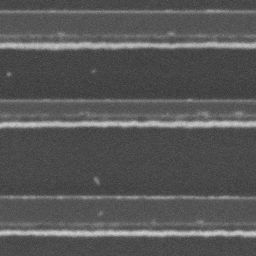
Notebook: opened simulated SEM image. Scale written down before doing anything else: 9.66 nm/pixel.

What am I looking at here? lines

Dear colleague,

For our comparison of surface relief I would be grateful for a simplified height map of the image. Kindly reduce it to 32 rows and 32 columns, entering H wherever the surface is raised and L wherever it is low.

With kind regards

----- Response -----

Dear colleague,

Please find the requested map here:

LLLLLLLLLLLLLLLLLLLLLLLLLLLLLLLL
HHHHHHHHHHHHHHHHHHHHHHHHHHHHHHHH
HHHHHHHHHHHHHHHHHHHHHHHHHHHHHHHH
HHHHHHHHHHHHHHHHHHHHHHHHHHHHHHHH
HHHHHHHHHHHHHHHHHHHHHHHHHHHHHHHH
HHHHHHHHHHHHHHHHHHHHHHHHHHHHHHHH
LLLLLLLLLLLLLLLLLLLLLLLLLLLLLLLL
LLLLLLLLLLLLLLLLLLLLLLLLLLLLLLLL
LLLLLLLLLLLLLLLLLLLLLLLLLLLLLLLL
LLLLLLLLLLLLLLLLLLLLLLLLLLLLLLLL
LLLLLLLLLLLLLLLLLLLLLLLLLLLLLLLL
LLLLLLLLLLLLLLLLLLLLLLLLLLLLLLLL
LLLLLLLLLLLLLLLLLLLLLLLLLLLLLLLL
HHHHHHHHHHHHHHHHHHHHHHHHHHHHHHHH
HHHHHHHHHHHHHHHHHHHHHHHHHHHHHHHH
HHHHHLLLLLLLLLLLLLLLLLLLLLLLLLLL
LLLLLLLLLLLLLLLLLLLLLLLLLLLLLLLL
LLLLLLLLLLLLLLLLLLLLLLLLLLLLLLLL
LLLLLLLLLLLLLLLLLLLLLLLLLLLLLLLL
LLLLLLLLLLLLLLLLLLLLLLLLLLLLLLLL
LLLLLLLLLLLLLLLLLLLLLLLLLLLLLLLL
LLLLLLLLLLLLLLLLLLLLLLLLLLLLLLLL
LLLLLLLLLLLLLLLLLLLLLLLLLLLLLLLL
LLLLLLLLLLLLLLLLLLLLLLLLLLLLLLLL
LLLLLLLLLLLLLLLLLLLLLLLLLLLLLLLL
HHHHHHHHHHHHHHHHHHHHHHHHHHHHHHHH
HHHHHHHHHHHHHHHHHHHHHHHHHHHHHHHH
HHHHHHHHHHHHHHHHHHHHHHHHHHHHHHHH
HHHHHHHHHHHHHHHHHHHHHHHHHHHHHHHH
LLLLLLLLLLLLLLLLLLLLLLLLLLLLLLLL
LLLLLLLLLLLLLLLLLLLLLLLLLLLLLLLL
LLLLLLLLLLLLLLLLLLLLLLLLLLLLLLLL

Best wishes